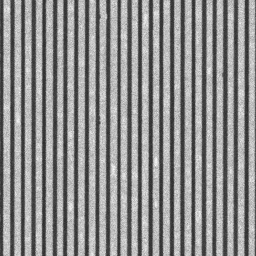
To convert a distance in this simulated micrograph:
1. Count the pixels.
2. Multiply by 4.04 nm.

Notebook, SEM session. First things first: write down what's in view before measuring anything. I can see parallel lines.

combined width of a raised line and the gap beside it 43.1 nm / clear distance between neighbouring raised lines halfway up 17.1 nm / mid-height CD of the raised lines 27.7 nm